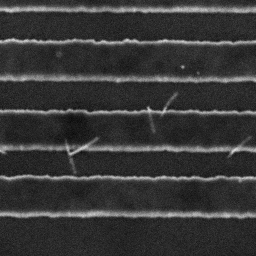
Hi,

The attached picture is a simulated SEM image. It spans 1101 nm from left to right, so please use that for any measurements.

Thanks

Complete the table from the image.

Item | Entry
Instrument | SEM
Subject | lines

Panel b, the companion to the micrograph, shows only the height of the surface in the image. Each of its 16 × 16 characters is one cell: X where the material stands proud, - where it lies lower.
XXXXXXXXXXXXXXXX
----------------
----------------
XXXXXXXXXXXXXXXX
XXXXXXXXXXXXXXXX
----------------
----------------
XXXXXXXXXXXXXXXX
XXXXXXXXXXXXXXXX
----------------
----------------
XXXXXXXXXXXXXXXX
XXXXXXXXXXXXXXXX
-X-X----X--XXXXX
----------------
----------------